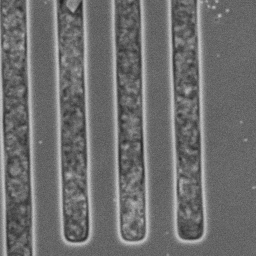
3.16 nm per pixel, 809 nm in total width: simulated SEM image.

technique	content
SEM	groups of lines, slits or small figures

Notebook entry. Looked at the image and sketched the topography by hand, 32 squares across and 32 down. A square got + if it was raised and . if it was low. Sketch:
...++++.++++++....+++....+++++++
...++++...++++....+++....+++++++
...++++....+++....+++....+++++++
...++++....+++....+++....+++++++
....+++....+++....+++....+++++++
....+++....+++....+++....+++++++
....+++....+++....+++....+++++++
....+++....+++....+++....+++++++
....+++....+++....++++...+++++++
....+++....+++....++++...+++++++
....+++....+++....++++...+++++++
....+++....+++....++++...+++++++
....+++....+++....++++...+++++++
....+++....++++...++++...+++++++
....+++....++++...++++...+++++++
....+++....++++...++++...+++++++
....+++....++++...++++...+++++++
....+++....++++...++++...+++++++
....++++...++++...++++...+++++++
....++++...++++...++++...+++++++
....++++...++++...++++...+++++++
+...++++...++++...++++...+++++++
+...++++...++++...++++...+++++++
+...++++...++++...++++...+++++++
+...++++...++++...++++...+++++++
+...++++...++++...++++...+++++++
+...++++...++++...++++...+++++++
+...++++...++++...++++....++++++
+...++++...++++...++++...+++++++
+...++++...++++...++++...+++++++
+...++++++++++++++++++++++++++++
+...++++++++++++++++++++++++++++